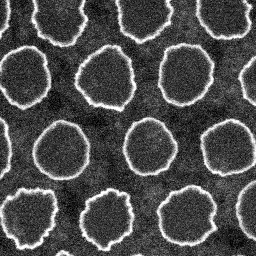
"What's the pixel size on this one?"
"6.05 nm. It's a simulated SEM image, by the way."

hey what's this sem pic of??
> raised bodies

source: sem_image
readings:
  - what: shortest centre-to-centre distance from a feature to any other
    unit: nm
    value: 476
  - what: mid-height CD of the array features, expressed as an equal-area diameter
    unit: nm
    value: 344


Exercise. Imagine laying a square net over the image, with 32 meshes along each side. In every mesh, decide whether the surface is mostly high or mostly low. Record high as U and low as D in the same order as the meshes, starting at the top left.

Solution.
UDDDUUUUUUDDDDDUUUUUUDDDDUUUUUUD
UDDDUUUUUUDDDDDUUUUUUDDDDUUUUUUD
UDDDUUUUUUUDDDDUUUUUUDDDDUUUUUUD
UDDDDUUUUUDDDDDUUUUUDDDDDDUUUUUD
DDDDDUUUUUDDDDDDUUUDDDDDDDDUUUDD
DDDDDDDUUDDDDDDDDDDDDDDDDDDDDDDD
DDUUUDDDDDDDUUUDDDDDDUUUUDDDDDDD
UUUUUUDDDDDUUUUUDDDDUUUUUUDDDDDD
UUUUUUDDDDUUUUUUDDDDUUUUUUUDDDDU
UUUUUUDDDDUUUUUUUDDDUUUUUUDDDDUU
UUUUUUDDDDUUUUUUUDDDUUUUUUDDDDUU
UUUUUUDDDDUUUUUUUDDDUUUUUUDDDDDU
DUUUUDDDDDDUUUUUDDDDDUUUDDDDDDDU
DDDDDDDDDDDDDDUDDDDDDDDDDDDDDDDD
DDDDDDDDDDDDDDDDDDDDDDDDDDDDDDDD
UDDDDDDUUDDDDDDDDUUUDDDDDDDUUUDD
UDDDDDUUUUDDDDDDUUUUUDDDDDUUUUUD
UDDDDUUUUUUDDDDDUUUUUUDDDUUUUUUU
UDDDUUUUUUUDDDDDUUUUUUDDDUUUUUUU
UDDDUUUUUUUDDDDDUUUUUUDDDDUUUUUU
UDDDDUUUUUUDDDDDUUUUUDDDDDUUUUUU
UDDDDUUUUUDDDDDDDUUUDDDDDDDUUDDD
DDDDDDDDDDDDDDDDDDDDDDDDDDDDDDDD
DDDDDDDDDDDDDDDDDDDDDDDUUDDDDDDU
DDUUUUUDDDDDUUUUDDDDDUUUUUDDDDUU
DUUUUUUDDDDUUUUUDDDDUUUUUUUDDDUU
UUUUUUUDDDUUUUUUDDDDUUUUUUUDDDUU
UUUUUUUDDDUUUUUUDDDDUUUUUUDDDDUU
DUUUUUDDDDUUUUUUDDDDUUUUUUUDDDUU
DUUUUUDDDDDUUUUUDDDDDUUUUUDDDDDU
DDUUUDDDDDDDUUDDDDDDDDDDDDDDDDDD
DDDDDDDDDDDDDDDDDDDDDDDDDDDDDDDD